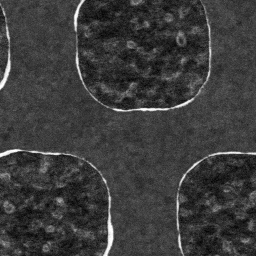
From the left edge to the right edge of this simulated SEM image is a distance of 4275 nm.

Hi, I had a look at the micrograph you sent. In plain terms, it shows holes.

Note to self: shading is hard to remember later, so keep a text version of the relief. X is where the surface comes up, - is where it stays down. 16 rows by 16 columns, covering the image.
XXXXX--------XXX
XXXXX--------XXX
-XXXX--------XXX
-XXXX--------XXX
XXXXX--------XXX
XXXXX--------XXX
XXXXXX-----XXXXX
XXXXXXXXXXXXXXXX
XXXXXXXXXXXXXXXX
X-XXXXXXXXXXXXXX
------XXXXXX----
-------XXXX-----
-------XXXX-----
-------XXXX-----
-------XXXX-----
-------XXXX-----